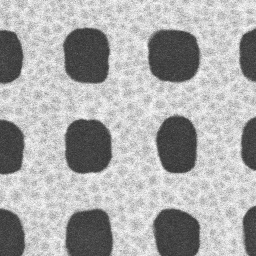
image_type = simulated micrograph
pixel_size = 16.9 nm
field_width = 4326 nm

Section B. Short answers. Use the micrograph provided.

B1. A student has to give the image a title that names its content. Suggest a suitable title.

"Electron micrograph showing holes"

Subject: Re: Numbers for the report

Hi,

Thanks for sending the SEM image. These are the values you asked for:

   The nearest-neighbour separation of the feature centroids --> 1480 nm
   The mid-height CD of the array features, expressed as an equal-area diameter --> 896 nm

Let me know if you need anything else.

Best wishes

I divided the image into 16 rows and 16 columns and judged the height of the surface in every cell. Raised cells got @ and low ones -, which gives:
@@@@@@@@@@@@@@@@
@@@@@@@@@@@@@@@@
-@@@---@@---@@@-
-@@@---@@----@@-
-@@@---@@---@@@-
@@@@@@@@@@@@@@@@
@@@@@@@@@@@@@@@@
@@@@@-@@@@--@@@@
-@@@---@@@--@@@-
-@@@---@@@--@@@-
-@@@---@@@--@@@@
@@@@@@@@@@@@@@@@
@@@@@@@@@@@@@@@@
-@@@@--@@@--@@@-
-@@@---@@@--@@@-
--@@---@@@--@@@-